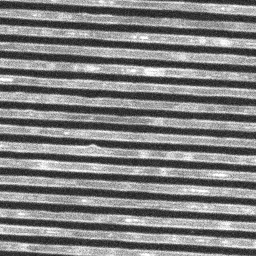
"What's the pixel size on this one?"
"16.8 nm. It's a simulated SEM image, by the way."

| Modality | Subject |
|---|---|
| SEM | parallel lines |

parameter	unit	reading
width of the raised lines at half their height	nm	176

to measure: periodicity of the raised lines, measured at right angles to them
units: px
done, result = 16.6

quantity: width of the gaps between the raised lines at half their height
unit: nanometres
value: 113